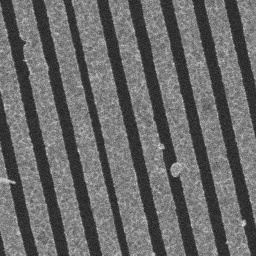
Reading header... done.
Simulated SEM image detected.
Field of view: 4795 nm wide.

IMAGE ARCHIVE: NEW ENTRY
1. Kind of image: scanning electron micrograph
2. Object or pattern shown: parallel lines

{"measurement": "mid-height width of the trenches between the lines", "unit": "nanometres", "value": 235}